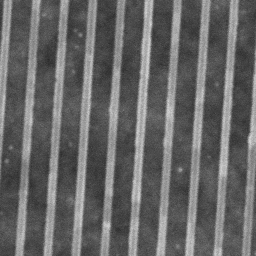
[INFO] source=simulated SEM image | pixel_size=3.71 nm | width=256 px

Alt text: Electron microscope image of parallel lines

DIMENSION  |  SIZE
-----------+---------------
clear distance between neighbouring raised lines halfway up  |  81.4 nm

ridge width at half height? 25 nm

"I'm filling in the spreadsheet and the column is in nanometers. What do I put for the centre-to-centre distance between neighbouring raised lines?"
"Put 105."